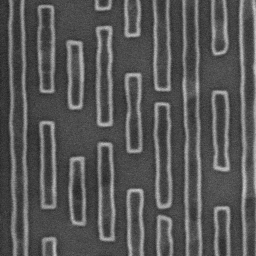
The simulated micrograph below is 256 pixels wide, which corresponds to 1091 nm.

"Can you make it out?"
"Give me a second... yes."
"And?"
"wiring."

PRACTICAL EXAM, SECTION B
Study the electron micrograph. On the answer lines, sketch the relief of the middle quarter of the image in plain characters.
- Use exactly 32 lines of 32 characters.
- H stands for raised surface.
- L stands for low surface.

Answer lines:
LHHHLLLLLHHLLLLLLLLLLLLHHHLLLLHH
LHHHLLLLLHHLLLLLLLLLLLLHHHLLLLHH
LHHHLLLLLHHLLLLLLLLLLLLHHHLLLLHH
LHHHLLLLLHHLLLLLHHHLLLLHHHLLLLHH
LLHHLLLLHHHLLLLLHHHLLLLHHHLLLLHH
LHHHLLLLHHHLLLLLHHHLLLLHHHLLLLHH
LHHHLLLLHHHLLLLLHHHLLLLLLLLLLLHH
LHHHLLLLLHHLLLLLHHHLLLLLLLLLLLHH
LHHHLLLLLHHLLLLLHHHLLLLLLLLLLLHH
LHHHLLLLLHHLLLLLHHHLLLLLLLLLLLHH
LLHHLLLLLHHLLLLLHHLLLLLHHHLLLLHH
LLLLLLLLLHHLLLLLHHLLLLLHHHLLLLHH
LLLLLLLLLHHLLLLLHHHLLLLHHHLLLLHH
LLLLLLLLLHHHLLLLHHHLLLLHHHLLLLHH
LLLLLLLLLHHHLLLLHHHLLLLHHHLLLLHH
LLLLLLLLLLLLLLLLHHHLLLLHHHLLLLHH
LLLLLLLLLLLLLLLLHHHLLLLHHHLLLLLH
LLLLLLLLLLLLLLLLHHHLLLLHHHLLLLLH
LLLLLLLLLLLLLLLLHHHLLLLHHHLLLLLH
LLLLLLLLLLLLLLLLHHHLLLLHHHLLLLLH
LLLLLLLLLHHLLLLLHHHLLLLHHHLLLLLH
LLLLLLLLLHHHLLLLHHHLLLLHHHLLLLLH
LLLLLLLLLHHHLLLLLLLLLLLLHHLLLLLH
LLLLLLLLLHHHLLLLLLLLLLLLHHLLLLLH
LLHHHLLLLHHHLLLLLLLLLLLLHHLLLLLH
LLHHLLLLLHHHLLLLLLLLLLLLHHLLLLLH
LLHHHLLLLHHHLLLLLLLLLLLLHHLLLLLH
LLHHHLLLLHHHLLLLLLLLLLLLHHLLLLLH
LLHHLLLLLHHHLLLLLLLLLLLLHHLLLLLH
LLHHHLLLLHHHLLLLLLLLLLLHHHHLLLLH
LLHHHLLLLHHHLLLLLLLLLLLLHHHLLLLH
LLHHHLLLLHHHLLLLLLLLLLLLHHHLLLLH